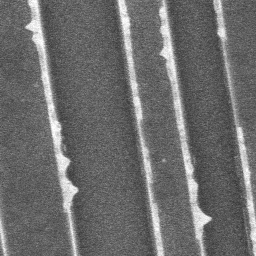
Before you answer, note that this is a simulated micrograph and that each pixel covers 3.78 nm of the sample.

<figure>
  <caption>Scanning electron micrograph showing one or a few lines or trenches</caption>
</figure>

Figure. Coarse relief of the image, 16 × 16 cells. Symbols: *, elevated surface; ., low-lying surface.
**.....***...***
**......**....**
***.....***...**
***.....***...**
***.....***...**
***.....***...**
***.....***....*
****.....**....*
****.....***...*
****.....***...*
****.....***...*
*****....***...*
*****....***...*
****......***...
****......***...
*****.....***...